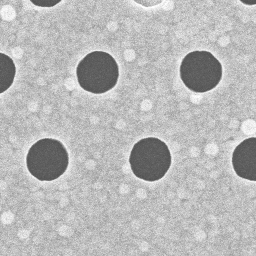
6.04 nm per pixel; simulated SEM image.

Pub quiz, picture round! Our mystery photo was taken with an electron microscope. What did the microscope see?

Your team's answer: holes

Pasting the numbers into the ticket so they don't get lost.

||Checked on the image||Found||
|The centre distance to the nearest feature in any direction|609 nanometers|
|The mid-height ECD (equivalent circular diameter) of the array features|259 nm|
